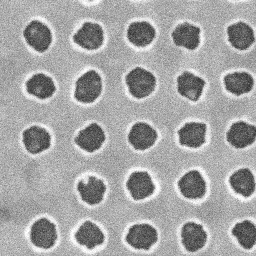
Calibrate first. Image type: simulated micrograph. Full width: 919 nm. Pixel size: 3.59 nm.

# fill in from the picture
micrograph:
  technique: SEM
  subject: a regular array of holes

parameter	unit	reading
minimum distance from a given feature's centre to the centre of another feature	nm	176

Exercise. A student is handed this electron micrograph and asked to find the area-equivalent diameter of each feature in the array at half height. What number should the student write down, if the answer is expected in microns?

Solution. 0.107